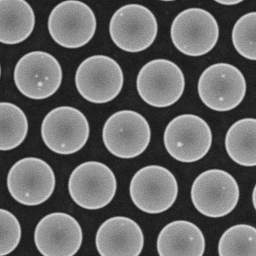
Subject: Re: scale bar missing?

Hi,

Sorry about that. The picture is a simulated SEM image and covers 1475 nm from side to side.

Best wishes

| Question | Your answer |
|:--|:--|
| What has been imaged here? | an array of small figures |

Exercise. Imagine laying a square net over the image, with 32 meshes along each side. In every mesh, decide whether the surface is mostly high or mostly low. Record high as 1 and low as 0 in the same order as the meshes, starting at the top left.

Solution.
11110001111000000000000000001000
11110011111100111110000111000000
11110011111100111111001111100011
11110011111100111111011111100111
11110011111100111110011111100111
01000001111000111110001111100111
00001000000000001000000111000011
00111110000111000001100000000000
00111111001111100011110000111100
00111111011111100111111001111100
00111110011111100111111001111110
00011110001111100111111001111110
00000000000111000011110001111100
11000001100000000000000000111000
11100011111000111100001110000000
11100111111001111110011111000111
11100111111001111110011111001111
11100111111001111110111111001111
11000011110001111100011111001111
00000000000000011000011111000111
00111100001110000000000000000011
01111110011111000111100001110000
01111110011111001111110011111000
01111110011111101111110011111100
00111100011111001111110011111100
00011000001110000111110011111100
10000000000000000011000001111000
11000111100001110000000000000000
11101111110011111100111110000111
11101111110011111100111110001111
11001111110011111100111111011111
10000111110011111100111111011111